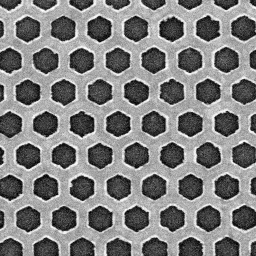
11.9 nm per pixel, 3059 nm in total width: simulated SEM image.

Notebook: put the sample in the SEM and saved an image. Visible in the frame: a regular array of holes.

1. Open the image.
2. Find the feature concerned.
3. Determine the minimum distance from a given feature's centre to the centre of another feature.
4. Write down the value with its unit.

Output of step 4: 428 nm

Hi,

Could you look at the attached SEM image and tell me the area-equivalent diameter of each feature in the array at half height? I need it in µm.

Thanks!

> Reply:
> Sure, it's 0.306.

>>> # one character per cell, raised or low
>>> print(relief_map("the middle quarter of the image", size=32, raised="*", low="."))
*......***.......**.......**....
***....****.....****.....****...
****.********.********.*********
********************************
..******...*****....*****....***
...***......***......***......**
...***......***......***......**
...***......***......***......**
...***......***......***......**
..*****....******...*****....***
********************************
********************************
**....******...******...******..
*......***.......**......****...
*.......**.......**.......**....
*.......**.......**.......**....
*......****......**.......***...
***....*****....*****...******..
********************************
********************************
..*****...******....*****....***
...***......***......***......**
...***......***......***......**
...***......***......***......**
...***......***......***......**
..*****....*****....*****....***
********************************
*************.********.********.
***....****.....****.....*****..
**......**.......***......**....
**......**.......**.......***...
*.......***......**.......**....